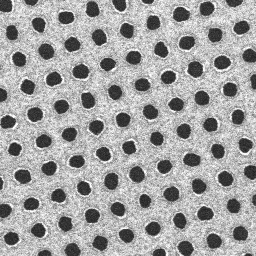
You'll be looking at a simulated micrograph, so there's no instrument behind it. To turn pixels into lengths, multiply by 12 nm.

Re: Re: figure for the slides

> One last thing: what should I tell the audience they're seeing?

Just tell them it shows a regular array of holes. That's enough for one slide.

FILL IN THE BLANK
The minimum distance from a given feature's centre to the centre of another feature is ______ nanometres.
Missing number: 329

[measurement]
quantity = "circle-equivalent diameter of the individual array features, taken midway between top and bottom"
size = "14.9 pixels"